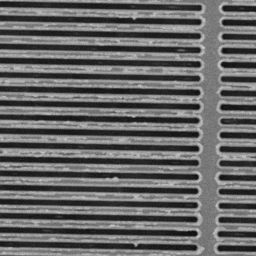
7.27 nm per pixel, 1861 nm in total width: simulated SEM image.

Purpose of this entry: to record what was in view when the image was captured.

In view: parallel lines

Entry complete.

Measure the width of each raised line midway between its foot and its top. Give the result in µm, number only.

0.0472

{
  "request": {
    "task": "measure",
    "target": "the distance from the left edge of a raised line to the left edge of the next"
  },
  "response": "103 nanometers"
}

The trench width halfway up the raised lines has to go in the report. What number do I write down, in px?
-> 7.5